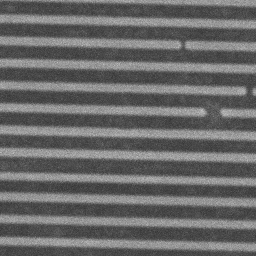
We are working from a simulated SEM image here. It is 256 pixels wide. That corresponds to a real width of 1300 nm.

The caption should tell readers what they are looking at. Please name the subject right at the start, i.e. parallel lines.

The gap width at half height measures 77.5 nanometers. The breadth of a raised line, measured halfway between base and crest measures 34.9 nm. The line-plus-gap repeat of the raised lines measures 22.3 px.